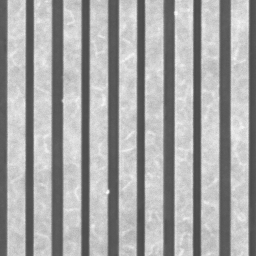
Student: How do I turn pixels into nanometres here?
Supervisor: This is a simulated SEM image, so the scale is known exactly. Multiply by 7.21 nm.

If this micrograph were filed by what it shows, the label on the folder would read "parallel lines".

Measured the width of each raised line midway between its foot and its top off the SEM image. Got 140 nm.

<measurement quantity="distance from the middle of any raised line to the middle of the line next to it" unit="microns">0.201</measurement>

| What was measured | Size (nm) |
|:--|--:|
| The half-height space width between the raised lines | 63.1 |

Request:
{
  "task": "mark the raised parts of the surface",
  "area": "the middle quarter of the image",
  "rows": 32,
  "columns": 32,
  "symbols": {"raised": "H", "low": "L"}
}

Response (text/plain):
HHHHLLHHHHHLLLHHHHLLHHHHHLLLHHHH
HHHHLLHHHHHLLLHHHHLLHHHHHLLLHHHH
HHHHLLHHHHHLLLHHHHLLHHHHHLLLHHHH
HHHHLLHHHHHLLLHHHHLLHHHHHLLLHHHH
HHHHLLHHHHHLLLHHHHLLHHHHHLLLHHHH
HHHHLLHHHHHLLLHHHHLLHHHHHLLLHHHH
HHHHLLHHHHHLLLHHHHLLHHHHHLLLHHHH
HHHHLLHHHHHLLLHHHHLLHHHHHLLLHHHH
HHHHLLHHHHHLLLHHHHLLHHHHHLLLHHHH
HHHHLLHHHHHLLLHHHHLLHHHHHLLLHHHH
HHHHLLHHHHHLLLHHHHLLHHHHHLLLHHHH
HHHHLLHHHHHLLLHHHHLLHHHHHLLLHHHH
HHHHLLHHHHHLLLHHHHLLHHHHHLLLHHHH
HHHHLLHHHHHLLLHHHHLLHHHHHLLLHHHH
HHHHLLHHHHHLLLHHHHLLHHHHHLLLHHHH
HHHHLLHHHHHLLLHHHHLLHHHHHLLLHHHH
HHHHLLHHHHHLLLHHHHLLHHHHHLLLHHHH
HHHHLLHHHHHLLLHHHHLLHHHHHLLLHHHH
HHHHLLHHHHHLLLHHHHLLHHHHHLLLHHHH
HHHHLLHHHHHLLLHHHHLLHHHHHLLLHHHH
HHHHLLHHHHHLLLHHHHLLHHHHHLLLHHHH
HHHHLLHHHHHLLLHHHHLLHHHHHLLLHHHH
HHHHLLHHHHHLLLHHHHLLHHHHHLLLHHHH
HHHHLLHHHHHLLLHHHHLLHHHHHLLLHHHH
HHHHLLHHHHHLLLHHHHLLHHHHHLLLHHHH
HHHHLLHHHHHLLLHHHHLLHHHHHLLLHHHH
HHHHLLHHHHHLLLHHHHLLHHHHHLLLHHHH
HHHHLLHHHHHLLLHHHHLLHHHHHLLLHHHH
HHHHLLHHHHHLLLHHHHLLHHHHHLLLHHHH
HHHHLLHHHHHLLLHHHHLLHHHHHLLLHHHH
HHHHLLHHHHHLLLHHHHLLHHHHHLLLHHHH
HHHHLLHHHHHLLLHHHHLLHHHHHLLLHHHH